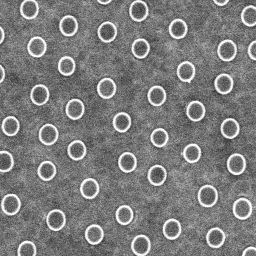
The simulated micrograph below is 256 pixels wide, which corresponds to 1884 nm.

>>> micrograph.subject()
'a regular array of raised bodies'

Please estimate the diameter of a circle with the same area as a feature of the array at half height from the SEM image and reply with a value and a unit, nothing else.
134 nm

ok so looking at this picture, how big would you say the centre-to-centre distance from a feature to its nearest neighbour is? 0.272 micrometres